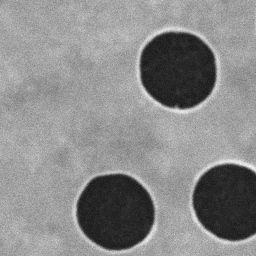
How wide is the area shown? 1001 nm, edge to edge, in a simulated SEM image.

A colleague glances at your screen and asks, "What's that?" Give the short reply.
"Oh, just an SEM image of holes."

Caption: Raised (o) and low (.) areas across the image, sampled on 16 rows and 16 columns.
oooooooooooooooo
oooooooooooooooo
ooooooooo....ooo
ooooooooo....ooo
ooooooooo.....oo
ooooooooo....ooo
oooooooooo...ooo
oooooooooooooooo
oooooooooooooooo
oooooooooooooooo
ooooooooooooo...
ooooo....ooo....
ooooo.....oo....
ooooo.....oo....
ooooo....oooo...
oooooo..oooooooo